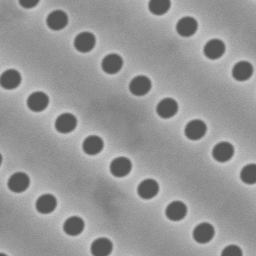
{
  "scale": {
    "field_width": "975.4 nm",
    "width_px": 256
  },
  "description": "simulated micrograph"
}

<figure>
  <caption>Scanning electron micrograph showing a regular array of holes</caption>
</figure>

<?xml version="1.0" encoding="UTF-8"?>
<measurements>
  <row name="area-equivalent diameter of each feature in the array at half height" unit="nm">80.7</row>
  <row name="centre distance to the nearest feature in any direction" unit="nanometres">134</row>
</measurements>